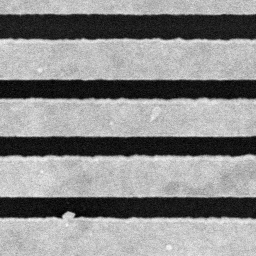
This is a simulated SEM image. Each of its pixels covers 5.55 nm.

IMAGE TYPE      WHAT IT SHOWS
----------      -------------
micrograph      lines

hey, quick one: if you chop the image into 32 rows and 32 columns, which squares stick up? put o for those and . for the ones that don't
oooooooooooooooooooooooooooooooo
oooooooooooooooooooooooooooooooo
................................
................................
................................
oooooooooooooooooooooooooooooooo
oooooooooooooooooooooooooooooooo
oooooooooooooooooooooooooooooooo
oooooooooooooooooooooooooooooooo
oooooooooooooooooooooooooooooooo
................................
................................
oooooooooooooooooooooooooooooooo
oooooooooooooooooooooooooooooooo
oooooooooooooooooooooooooooooooo
oooooooooooooooooooooooooooooooo
oooooooooooooooooooooooooooooooo
................................
................................
.o....o.o...o...oooooo...o.o..oo
oooooooooooooooooooooooooooooooo
oooooooooooooooooooooooooooooooo
oooooooooooooooooooooooooooooooo
oooooooooooooooooooooooooooooooo
oooooooooooooooooooooooooooooooo
................................
................................
oooooooooooooooooooooooooooooooo
oooooooooooooooooooooooooooooooo
oooooooooooooooooooooooooooooooo
oooooooooooooooooooooooooooooooo
oooooooooooooooooooooooooooooooo